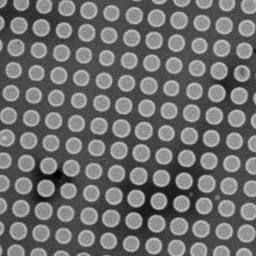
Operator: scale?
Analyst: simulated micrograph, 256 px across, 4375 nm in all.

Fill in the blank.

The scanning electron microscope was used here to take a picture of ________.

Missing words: an array of small figures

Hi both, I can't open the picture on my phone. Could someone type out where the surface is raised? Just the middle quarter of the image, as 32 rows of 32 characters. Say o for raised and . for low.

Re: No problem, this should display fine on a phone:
...............ooo..oooo..ooo..o
.....................oo...ooo..o
o..ooo...oo.....................
o.oooo..oooo..ooo...oo..........
...ooo..oooo..oooo.oooo...oo....
........ooo...oooo.oooo..oooo..o
...............oo..oooo..oooo..o
...oo................o....oo...o
..oooo..ooo...o................o
..ooo..oooo..oooo..ooo..........
..ooo...ooo..oooo..oooo..ooo...o
.........o...oooo..oooo.oooo..oo
...................ooo..oooo..oo
..oo.....................oo...oo
.oooo..oooo..ooo................
.oooo..oooo.oooo..oooo...o......
..oo...oooo.oooo..oooo..ooo...oo
.............ooo..oooo..ooo..ooo
..o................oo...ooo..ooo
.ooo...oo.....................oo
.ooo..oooo..oooo..oo............
.ooo..oooo..oooo.oooo...oo......
.......oo...oooo.oooo..oooo..ooo
.............oo...ooo..oooo..ooo
.oo.....................oo...ooo
oooo..ooo....o................o.
oooo..ooo..oooo..ooo............
ooo...ooo..oooo..oooo..ooo...oo.
......oo...oooo..oooo.oooo..oooo
.................ooo...ooo..oooo
ooo...oo................o...oooo
ooo..oooo..ooo..................